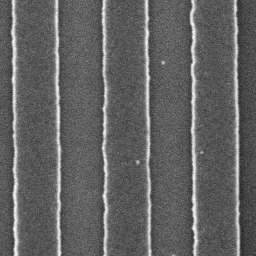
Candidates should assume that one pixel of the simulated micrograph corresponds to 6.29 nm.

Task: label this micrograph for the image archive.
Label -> lines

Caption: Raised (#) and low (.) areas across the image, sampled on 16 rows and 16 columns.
.###..###...###.
.###..###...###.
.###..###...###.
.###..###...###.
.###..###...###.
.###...##...###.
.###...##...###.
.###..###...###.
.###..###...###.
.###..###...###.
.###...##...###.
.###...##...###.
.###...##...###.
.###...##...###.
.###...##...###.
.###...##...###.